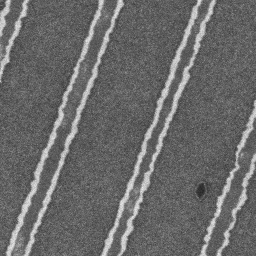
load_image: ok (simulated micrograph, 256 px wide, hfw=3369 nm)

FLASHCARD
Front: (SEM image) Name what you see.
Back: one or a few lines or trenches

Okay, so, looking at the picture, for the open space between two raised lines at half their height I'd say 73.3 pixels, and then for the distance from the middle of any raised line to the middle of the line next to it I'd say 1170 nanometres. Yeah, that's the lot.